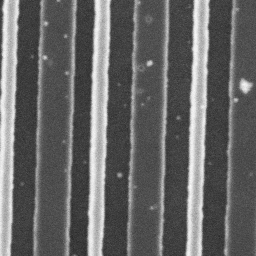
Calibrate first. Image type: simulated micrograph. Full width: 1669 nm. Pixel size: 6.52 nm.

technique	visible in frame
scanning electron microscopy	lines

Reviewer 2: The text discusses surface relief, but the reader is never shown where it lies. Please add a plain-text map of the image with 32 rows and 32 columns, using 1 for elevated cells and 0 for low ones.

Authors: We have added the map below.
11000111110011000111100011000111
11000111100011000111100011000111
01000111100011000111100011000111
11000111100011000111100011000111
01000111100011000111100011000111
11000111100011000111100011000111
11000111100011000111100011000111
11000111100011000111100011000111
11000111100010000111100011000111
11000111100010000111100011000111
11000111100010000111100011000111
11000111100010000111100011000111
11000111100010000111100011000111
11000111100010000111100011000111
11000111100010000111100011000111
11000111100010001111100011000111
11000111100110001111100011000111
11000111100110001111100011000111
11000111100110001111100011000111
11000111100110001111100011001111
11000111100110001111100010000111
11000111100110001111100010001111
11000111100110001111000010001111
11000111100110001111000010001111
10000111100110001111000010001111
10001111100110001111000110001111
10001111100110001111000110001111
10001111100110001111000110001111
10001111100110001111000110001111
10001111100110001111000110001111
10001111100110001111000110001111
10001111100110001111000110001111